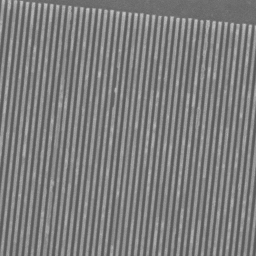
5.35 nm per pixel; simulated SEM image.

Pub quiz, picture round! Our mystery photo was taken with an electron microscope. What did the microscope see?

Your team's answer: parallel lines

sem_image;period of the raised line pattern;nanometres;32.4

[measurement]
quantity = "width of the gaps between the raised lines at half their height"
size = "15.3 nm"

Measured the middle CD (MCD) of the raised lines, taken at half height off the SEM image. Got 0.0153 µm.